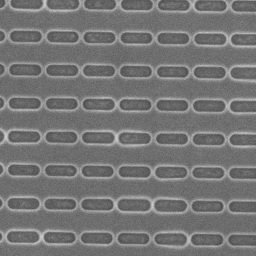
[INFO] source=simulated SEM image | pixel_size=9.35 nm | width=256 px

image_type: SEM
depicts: groups of lines, slits or small figures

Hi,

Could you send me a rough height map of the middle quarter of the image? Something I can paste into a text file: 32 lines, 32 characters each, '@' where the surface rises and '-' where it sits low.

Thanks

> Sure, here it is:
---@@-------@@@------@@@------@@
----@--------@--------@--------@
----@--------@--------@--------@
@@@@@@@@@@@@@@@@@@@@@@@@@@@@@@@@
@@@@@@@@@@@@@@@@@@@@@@@@@@@@@@@@
@@@@@@@@@@@@@@@@@@@@@@@@@@@@@@@@
@@@@@@@@@@@@@@@@@@@@@@@@@@@@@@@@
@@@@@@@@@@@@@@@@@@@@@@@@@@@@@@@@
--@@@@------@@@@@@@@@@@@@@@@@@@@
---@@--------@--------@--------@
---@@--------@--------@--------@
--@@@@------@@-------@@@-------@
@@@@@@@@@@@@@@@@@@@@@@@@@@@@@@@@
@@@@@@@@@@@@@@@@@@@@@@@@@@@@@@@@
@@@@@@@@@@@@@@@@@@@@@@@@@@@@@@@@
@@@@@@@@@@@@@@@@@@@@@@@@@@@@@@@@
@@@@@@@@@@@@@@@@@@@@@@@@@@@@@@@@
---@@-------@@-------@@@------@@
----------------------@--------@
---@@-------@@-------@@--------@
@@@@@@@@@@@@@@@@@@@@@@@@@@@@@@@@
@@@@@@@@@@@@@@@@@@@@@@@@@@@@@@@@
@@@@@@@@@@@@@@@@@@@@@@@@@@@@@@@@
@@@@@@@@@@@@@@@@@@@@@@@@@@@@@@@@
@@@@@@@@@@@@@@@@@@@@@@@@@@@@@@@@
---@@-------@@@-----@@@@----@@@@
---@--------@@--------@--------@
---@--------@@--------@--------@
@@@@@@-----@@@@------@@-------@@
@@@@@@@@@@@@@@@@@@@@@@@@@@@@@@@@
@@@@@@@@@@@@@@@@@@@@@@@@@@@@@@@@
@@@@@@@@@@@@@@@@@@@@@@@@@@@@@@@@